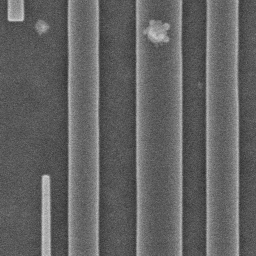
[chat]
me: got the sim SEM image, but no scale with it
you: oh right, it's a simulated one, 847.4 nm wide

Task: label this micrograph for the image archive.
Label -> groups of lines, slits or small figures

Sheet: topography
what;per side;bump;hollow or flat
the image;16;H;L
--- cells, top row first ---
LLLLHHLLLHHLLHHL
LLLLHHLLLHHLLHHL
LLLLHHLLLHHLLHHL
LLLLHHLLLHHLLHHL
LLLLHHLLLHHLLHHL
LLLLHHLLLHHLLHHL
LLLLHHLLLHHLLHHL
LLLLHHLLLHHLLHHL
LLLLHHLLLHHLLHHL
LLLLHHLLLHHLLHHL
LLLLHHLLLHHLLHHL
LLLLHHLLLHHLLHHL
LLLLHHLLLHHLLHHL
LLLLHHLLLHHLLHHL
LLLLHHLLLHHLLHHL
LLLLHHLLLHHLLHHL